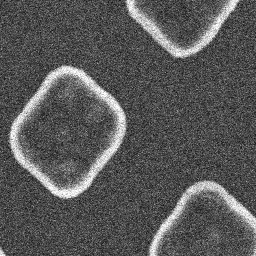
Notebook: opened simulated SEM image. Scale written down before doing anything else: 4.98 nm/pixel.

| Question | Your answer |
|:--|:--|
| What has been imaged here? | raised bodies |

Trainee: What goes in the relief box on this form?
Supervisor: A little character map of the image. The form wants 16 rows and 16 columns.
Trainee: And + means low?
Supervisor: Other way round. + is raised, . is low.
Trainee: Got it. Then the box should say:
........++++++..
.........+++++..
..........+++...
................
....+...........
...+++..........
..+++++.........
.+++++++........
.++++++.........
.++++++.........
..++++..........
...++...........
...........+++..
...........++++.
..........++++++
..........++++++